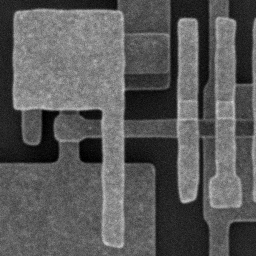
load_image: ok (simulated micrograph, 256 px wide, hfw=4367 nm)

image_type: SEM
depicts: wiring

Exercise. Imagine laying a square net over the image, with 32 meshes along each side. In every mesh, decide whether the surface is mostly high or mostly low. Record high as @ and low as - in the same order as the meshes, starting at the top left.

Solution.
--------------------------------
--@@@@@@@@@@@@@-----------------
--@@@@@@@@@@@@@--------@---@@---
--@@@@@@@@@@@@@-------@@@--@@---
--@@@@@@@@@@@@@@@@@@@-@@@--@@---
--@@@@@@@@@@@@@@@@@@@-@@@--@@---
--@@@@@@@@@@@@@@@@@@@-@@@--@@---
--@@@@@@@@@@@@@@@@@@@-@@@--@@---
--@@@@@@@@@@@@@@@@@@@-@@@--@@---
--@@@@@@@@@@@@@@------@@@--@@---
--@@@@@@@@@@@@@@------@@@--@@---
--@@@@@@@@@@@@@@------@@@--@@---
--@@@@@@@@@@@@@@------@@@--@@---
--@@@@@@@@@@@@@@------@@@--@@---
-------@@@---@@-------@@@--@@---
-------@@@@@@@@@@@@@@@@@@@@@@@@@
-------@@@@@@@@@@@@@@@@@@@@@@@@@
-------@@@---@@@------@@@--@@@--
-------------@@-------@@@--@@---
-------------@@-------@@@--@@---
-------------@@-------@@@--@@---
-------------@@-------@@@--@@@--
-------------@@-------@@@-@@@@--
-------------@@-------@@@-@@@@--
-------------@@--------@@-@@@@--
-------------@@-----------@@@@--
-------------@@-----------------
-------------@@-----------------
-------------@@-----------------
-------------@@-----------------
-------------@@-----------------
--------------------------------